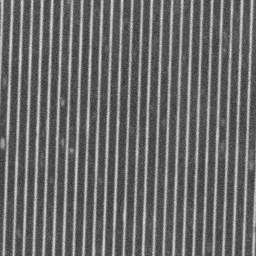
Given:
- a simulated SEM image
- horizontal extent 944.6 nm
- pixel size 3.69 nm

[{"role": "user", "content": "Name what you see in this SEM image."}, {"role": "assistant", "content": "parallel lines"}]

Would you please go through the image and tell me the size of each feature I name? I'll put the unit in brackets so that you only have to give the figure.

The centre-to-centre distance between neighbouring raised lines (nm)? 36.9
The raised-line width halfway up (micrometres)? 0.0055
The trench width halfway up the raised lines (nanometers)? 31.4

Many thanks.